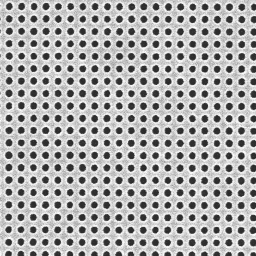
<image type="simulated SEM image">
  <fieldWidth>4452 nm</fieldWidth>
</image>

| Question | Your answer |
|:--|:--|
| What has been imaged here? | a regular array of holes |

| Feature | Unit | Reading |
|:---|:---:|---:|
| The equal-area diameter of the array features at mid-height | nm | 132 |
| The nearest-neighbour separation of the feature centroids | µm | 0.208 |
